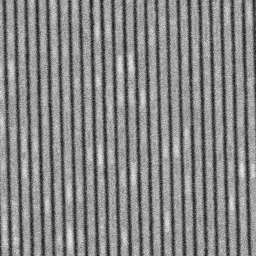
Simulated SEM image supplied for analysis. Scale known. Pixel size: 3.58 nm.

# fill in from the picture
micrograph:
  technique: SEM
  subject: parallel lines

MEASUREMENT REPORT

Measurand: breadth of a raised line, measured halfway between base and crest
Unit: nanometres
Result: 27.7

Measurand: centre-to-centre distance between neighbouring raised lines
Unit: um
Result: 0.0388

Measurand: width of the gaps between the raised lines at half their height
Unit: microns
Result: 0.0121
